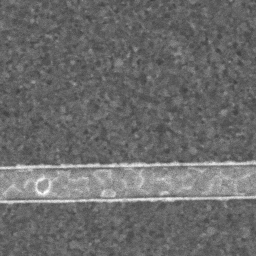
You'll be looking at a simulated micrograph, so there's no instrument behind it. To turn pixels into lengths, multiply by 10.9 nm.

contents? one or a few lines or trenches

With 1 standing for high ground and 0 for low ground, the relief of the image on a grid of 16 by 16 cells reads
1111111111111111
1111111111111111
1111111111111111
1111111111111111
1111111111111111
1111111111111111
1111111111111111
1111111111111111
1111111111111111
1111111111111111
0000000000000000
0000000000000000
0000000111111111
1111111111111111
1111111111111111
1111111111111111